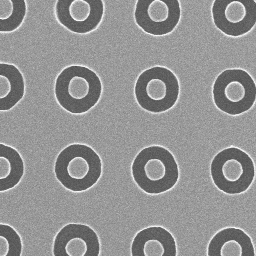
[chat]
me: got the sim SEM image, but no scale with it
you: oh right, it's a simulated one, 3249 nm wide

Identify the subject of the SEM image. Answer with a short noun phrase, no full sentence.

ring-shaped grooves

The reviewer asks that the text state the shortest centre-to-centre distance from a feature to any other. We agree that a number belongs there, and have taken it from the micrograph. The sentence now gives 0.981 micrometres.